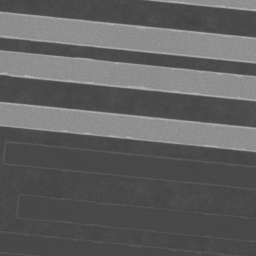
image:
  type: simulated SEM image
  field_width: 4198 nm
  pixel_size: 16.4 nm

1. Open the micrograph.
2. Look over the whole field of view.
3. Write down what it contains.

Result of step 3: parallel lines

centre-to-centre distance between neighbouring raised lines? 732 nm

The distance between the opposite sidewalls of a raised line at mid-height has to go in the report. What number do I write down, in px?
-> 23.3